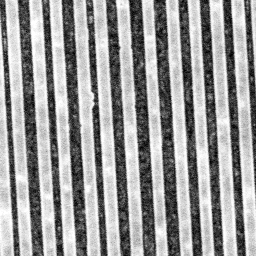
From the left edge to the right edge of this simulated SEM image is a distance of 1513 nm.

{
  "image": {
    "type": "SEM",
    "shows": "parallel lines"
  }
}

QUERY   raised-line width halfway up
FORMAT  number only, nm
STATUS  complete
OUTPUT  62.6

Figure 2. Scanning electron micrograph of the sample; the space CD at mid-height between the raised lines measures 68.5 nm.